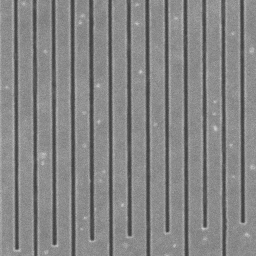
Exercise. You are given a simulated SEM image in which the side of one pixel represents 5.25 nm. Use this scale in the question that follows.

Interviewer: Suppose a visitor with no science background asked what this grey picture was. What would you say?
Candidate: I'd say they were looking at parallel lines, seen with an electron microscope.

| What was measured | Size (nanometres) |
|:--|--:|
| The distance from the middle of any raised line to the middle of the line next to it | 99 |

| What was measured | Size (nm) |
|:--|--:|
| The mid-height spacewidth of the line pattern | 24.3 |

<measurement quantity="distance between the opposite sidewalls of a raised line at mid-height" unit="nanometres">72.2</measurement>